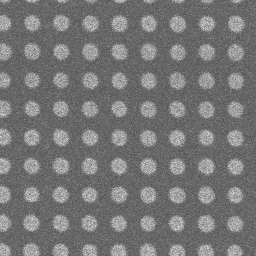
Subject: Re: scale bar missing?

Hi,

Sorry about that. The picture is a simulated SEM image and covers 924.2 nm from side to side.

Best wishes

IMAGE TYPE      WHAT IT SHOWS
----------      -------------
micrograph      a regular array of raised bodies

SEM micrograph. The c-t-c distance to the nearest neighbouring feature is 103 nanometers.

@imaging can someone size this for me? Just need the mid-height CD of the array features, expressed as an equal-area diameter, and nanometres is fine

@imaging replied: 56.5